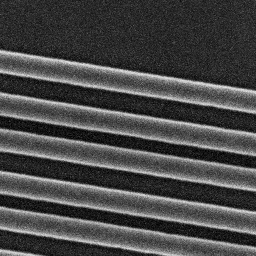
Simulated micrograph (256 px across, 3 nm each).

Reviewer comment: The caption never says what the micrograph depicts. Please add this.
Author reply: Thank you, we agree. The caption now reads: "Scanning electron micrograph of parallel lines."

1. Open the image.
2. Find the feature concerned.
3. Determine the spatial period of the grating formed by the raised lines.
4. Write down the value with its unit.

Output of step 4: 117 nanometers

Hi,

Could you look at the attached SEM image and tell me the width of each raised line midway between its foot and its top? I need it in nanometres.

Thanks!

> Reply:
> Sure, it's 63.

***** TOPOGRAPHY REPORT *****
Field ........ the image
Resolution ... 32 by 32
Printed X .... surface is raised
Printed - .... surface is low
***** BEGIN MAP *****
--------------------------------
--------------------------------
--------------------------------
--------------------------------
--------------------------------
--------------------------------
X-------------------------------
XXXXXXX-------------------------
XXXXXXXXXXXXX-------------------
---XXXXXXXXXXXXXXXXX------------
---------XXXXXXXXXXXXXXXXX------
----------------XXXXXXXXXXXXXXXX
XXXXX-----------------XXXXXXXXXX
XXXXXXXXXXX-----------------XXXX
-XXXXXXXXXXXXXXXXX--------------
-------XXXXXXXXXXXXXXXXX--------
XX------------XXXXXXXXXXXXXXXX--
XXXXXXXXX-----------XXXXXXXXXXXX
XXXXXXXXXXXXXXX-----------XXXXXX
-----XXXXXXXXXXXXXXXX-----------
-----------XXXXXXXXXXXXXXXXX----
-----------------XXXXXXXXXXXXXXX
XXXXXXX----------------XXXXXXXXX
XXXXXXXXXXXX------------------XX
--XXXXXXXXXXXXXXXXX-------------
--------XXXXXXXXXXXXXXXXXX------
XXX------------XXXXXXXXXXXXXXXX-
XXXXXXXXXX-----------XXXXXXXXXXX
XXXXXXXXXXXXXXXX------------XXXX
------XXXXXXXXXXXXXXXX----------
------------XXXXXXXXXXXXXXXXX---
XX----------------XXXXXXXXXXXXXX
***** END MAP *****